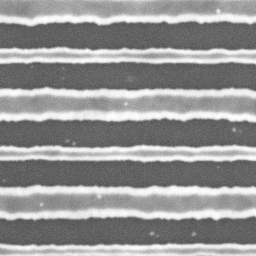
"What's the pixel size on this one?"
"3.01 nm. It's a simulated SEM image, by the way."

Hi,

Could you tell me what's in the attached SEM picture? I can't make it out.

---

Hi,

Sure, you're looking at lines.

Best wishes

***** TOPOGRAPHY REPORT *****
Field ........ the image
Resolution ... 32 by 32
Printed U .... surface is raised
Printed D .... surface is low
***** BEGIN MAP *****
UUUUUUUUUUUUUUUUUUUUUUUUUUUUUUUU
UUUUUUUUUUUUUUUUUUUUUUUUUUUUUUUU
UUUUUUUUUUUUUUUUUUUUUUUDUUUUDUUU
DDDDDDDDDDDDDDDDDDDDDDDDDDDDDDDD
DDDDDDDDDDDDDDDDDDDDDDDDDDDDDDDD
DDDDDDDDDDDDDDDDDDDDDDDDDDDDDDDD
UUUUUUUUUUUUUUUUUUUUUUUUUUUUUUUU
UUUUUUUUUUUUUUUUUUUUUUUUUUUUUUUU
DDDDDDDDDDDDDDDDDDDDDDDDDDDDDDDD
DDDDDDDDDDDDDDDDDDDDDDDDDDDDDDDD
DDDDDDDDDDDDDDDDDDDDDDDDDDDDDDDD
UUUUUUUUUUUUUUUUUUUUUUUUUUUUUUUU
UUUUUUUUUUUUUUUUUUUUUUUUUUUUUUUU
UUUUUUUUUUUUUUUUUUUUUUUUUUUUUUUU
UUUUUUUUUUUUUUUUUUUUUUUUUUUUUUUU
DDDDDDDDDDDDDDDDDDDDDDDDDDDDDDDD
DDDDDDDDDDDDDDDDDDDDDDDDDDDDDDDD
DDDDDDDDDDDDDDDDDDDDDDDDDDDDDDDD
UUDDUUUUDDDDDDDDUUUUUDUUDUUUUUUD
UUUUUUUUUUUUUUUUUUUUUUUUUUUUUUUU
DDDDDDDDDDDDDDDDDDDDDDDDDDDDDDDD
DDDDDDDDDDDDDDDDDDDDDDDDDDDDDDDD
DDDDDDDDDDDDDDDDDDDDDDDDDDDDDDDD
DDDDUUDUDDDDDDDDDDDUDDDDUDDDDDDD
UUUUUUUUUUUUUUUUUUUUUUUUUUUUUUUU
UUUUUUUUUUUUUUUUUUUUUUUUUUUUUUUU
UUUUUUUUUUUUUUUUUUUUUUUUUUUUUUUU
DDDDDDDDDDDDDDDDDDDDDDDDDDDDDDDD
DDDDDDDDDDDDDDDDDDDDDDDDDDDDDDDD
DDDDDDDDDDDDDDDDDDDDDDDDDDDDDDDD
DDDDDDDDDDDDDDDDDDDDDDDDDDDDDDDD
UUUUUUUUUUUUUUUUUUUUUUUUUUUUUUUU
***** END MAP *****